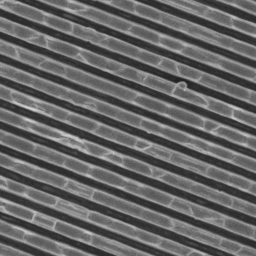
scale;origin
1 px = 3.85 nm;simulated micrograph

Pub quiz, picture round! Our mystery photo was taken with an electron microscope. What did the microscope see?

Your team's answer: parallel lines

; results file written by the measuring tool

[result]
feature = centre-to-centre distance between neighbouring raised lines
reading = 81.1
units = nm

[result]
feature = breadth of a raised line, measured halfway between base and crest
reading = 0.0513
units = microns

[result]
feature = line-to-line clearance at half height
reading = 29.7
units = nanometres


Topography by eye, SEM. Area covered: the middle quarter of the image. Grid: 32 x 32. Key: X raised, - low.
X------XXXXXXXXX------XXXXXXXXX-
XXXX------XXXXXXXXX-----XXXXXXXX
XXXXXXX-----XXXXXXXXXX-----XXXXX
XXXXXXXXX------XXXXXXXXX------XX
---XXXXXXXXX-----XXXXXXXXXX--X--
-----XXXXXXXXXX-----XXXXXXXXXXX-
XX------XXXXXXXXX------XXXXXXXXX
XXXX-------XXXXXXXXX-----XXXXXXX
XXXXXXXX-----XXXXXXXXXX-----XXXX
-XXXXXXXXX------XXXXXXXXX------X
----XXXXXXXXX-----XXXXXXXXXX----
X-----XXXXXXXXX------XXXXXXXXX--
XXX------XXXXXXXXX------XXXXXXXX
XXXXXX------XXXXXXXXX-----XXXXXX
XXXXXXXXX-----XXXXXXXXXX-----XXX
--XXXXXXXXX------XXXXXXXXX------
-----XXXXXXXXX-----XXXXXXXXXX---
X------XXXXXXXXX------XXXXXXXXX-
XXX-------XXXXXXXXX------XXXXXXX
XXXXXX-------XXXXXXXX------XXXXX
XXXXXXXXX------XXXXXXXXXX-----XX
----XXXXXXXX------XXXXXXXXX-----
------XXXXXXXX------XXXXXXXXXX--
XXX------XXXXXXXX------XXXXXXXXX
XXXXX-------XXXXXXXX------XXXXXX
XXXXXXXX------XXXXXXXX------XXXX
-XXXXXXXXXX-----XXXXXXXXX------X
----XXXXXXXXX------XXXXXXXXX----
X------XXXXXXXXX------XXXXXXXX--
XXX------XXXXXXXXXX------XXXXXXX
XXXXXX------XXXXXXXXX------XXXXX
XXXXXXXX-------XXXXXXXXX-----XXX